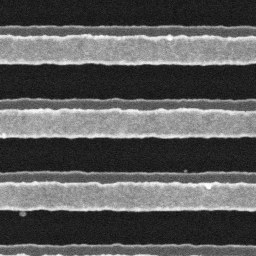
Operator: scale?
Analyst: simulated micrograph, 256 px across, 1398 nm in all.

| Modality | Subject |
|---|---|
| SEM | lines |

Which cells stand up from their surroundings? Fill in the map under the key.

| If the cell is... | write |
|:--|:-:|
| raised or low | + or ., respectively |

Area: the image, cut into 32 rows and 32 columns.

................................
................................
................................
++++++++++++++++++++++++++++++++
++++++++++++++++++++++++++++++++
++++++++++++++++++++++++++++++++
++++++++++++++++++++++++++++++++
++++++++++++++++++++++++++++++++
................................
................................
................................
................................
+++++++.++++++++.+..++++++....++
++++++++++++++++++++++++++++++++
++++++++++++++++++++++++++++++++
++++++++++++++++++++++++++++++++
++++++++++++++++++++++++++++++++
................................
................................
................................
................................
................................
++++++++++++++++++++++++++++++++
++++++++++++++++++++++++++++++++
++++++++++++++++++++++++++++++++
++++++++++++++++++++++++++++++++
................................
................................
................................
................................
................................
++++++++++++++++++++++++++++++++